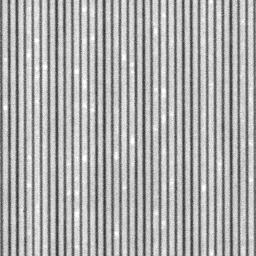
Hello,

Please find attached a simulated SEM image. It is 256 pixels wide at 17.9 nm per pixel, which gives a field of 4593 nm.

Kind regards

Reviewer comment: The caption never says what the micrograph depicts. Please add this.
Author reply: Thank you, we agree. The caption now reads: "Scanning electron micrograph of parallel lines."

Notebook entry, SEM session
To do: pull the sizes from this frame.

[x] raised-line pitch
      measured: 142 nanometres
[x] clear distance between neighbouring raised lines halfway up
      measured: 0.065 um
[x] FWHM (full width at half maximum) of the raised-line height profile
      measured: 0.0807 microns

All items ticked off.